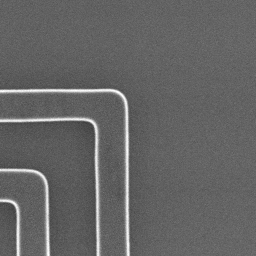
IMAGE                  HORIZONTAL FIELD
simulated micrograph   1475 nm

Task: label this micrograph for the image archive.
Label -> groups of lines, slits or small figures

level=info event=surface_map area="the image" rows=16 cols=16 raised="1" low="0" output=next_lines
0000000000000000
0000000000000000
0000000000000000
0000000000000000
0000000000000000
0000000000000000
1111111100000000
1111011100000000
0000001100000000
0000001100000000
0000001100000000
1110001100000000
1110001100000000
0110001100000000
0110001100000000
0110001100000000